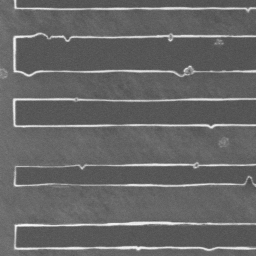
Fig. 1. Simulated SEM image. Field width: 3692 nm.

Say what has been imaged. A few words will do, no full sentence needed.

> one or a few lines or trenches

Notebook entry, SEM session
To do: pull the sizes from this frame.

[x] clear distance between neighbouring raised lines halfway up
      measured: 478 nm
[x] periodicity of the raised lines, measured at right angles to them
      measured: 873 nanometers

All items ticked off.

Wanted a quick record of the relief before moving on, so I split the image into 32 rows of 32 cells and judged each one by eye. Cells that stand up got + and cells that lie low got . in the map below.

..++++++++++++++++++++++++++++++
................................
................................
................................
....++...............+..........
..++++++++++++++++++++++++++++++
..++++++++++++++++++++++++++++++
..++++++++++++++++++++++++++++++
..++++++++++++++++++++++++++++++
................................
................................
................................
.......+++++..........+++++.++++
..++++++++++++++++++++++++++++++
..++++++++++++++++++++++++++++++
..++++++++++++++++++++++++++++++
................................
................................
................................
................................
........................+.......
..++++++++++++++++++++++++++++++
..++++++++++++++++++++++++++++++
................................
................................
................................
................................
................................
..++++++++++++++++++++++++++++++
..++++++++++++++++++++++++++++++
..++++++++++++++++++++++++++++++
................................